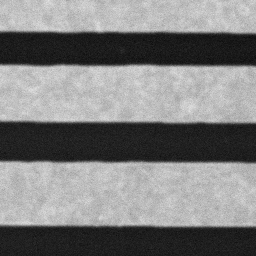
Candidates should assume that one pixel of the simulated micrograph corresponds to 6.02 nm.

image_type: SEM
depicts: lines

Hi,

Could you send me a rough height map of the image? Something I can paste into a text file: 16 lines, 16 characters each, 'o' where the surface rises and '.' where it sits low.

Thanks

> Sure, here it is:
oooooooooooooooo
oooooooooooooooo
................
................
oooooooooooooooo
oooooooooooooooo
oooooooooooooooo
oooooooooooooooo
................
................
oooooooooooooooo
oooooooooooooooo
oooooooooooooooo
oooooooooooooooo
................
................